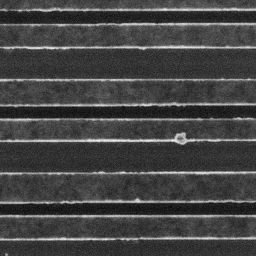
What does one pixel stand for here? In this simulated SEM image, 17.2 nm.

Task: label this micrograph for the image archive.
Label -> lines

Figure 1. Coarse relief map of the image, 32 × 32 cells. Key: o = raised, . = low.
oooooooooooooooooooooooooooooooo
................................
................................
oooooooooooooooooooooooooooooooo
oooooooooooooooooooooooooooooooo
oooooooooooooooooooooooooooooooo
................................
................................
................................
................................
oooooooooooooooooooooooooooooooo
oooooooooooooooooooooooooooooooo
oooooooooooooooooooooooooooooooo
................................
................................
oooooooooooooooooooooooooooooooo
oooooooooooooooooooooooooooooooo
oooooooooooooooooooooooooooooooo
................................
................................
................................
................................
oooooooooooooooooooooooooooooooo
oooooooooooooooooooooooooooooooo
oooooooooooooooooooooooooooooooo
................................
................................
oooooooooooooooooooooooooooooooo
oooooooooooooooooooooooooooooooo
oooooooooooooooooooooooooooooooo
................................
................................